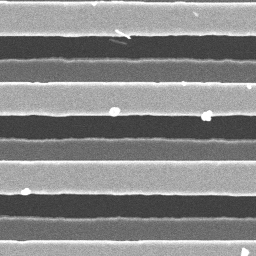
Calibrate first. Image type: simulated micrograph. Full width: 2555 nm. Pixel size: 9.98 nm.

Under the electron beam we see lines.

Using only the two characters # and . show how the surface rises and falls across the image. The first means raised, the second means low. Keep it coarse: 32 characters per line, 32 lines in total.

################################
################################
################################
################################
.......###....###.#.............
................................
................................
....####.....##...####.#........
################################
################################
################################
################################
################################
################################
......###.....#.........###.....
................................
................................
####.####################.##....
################################
################################
################################
################################
################################
################################
................................
................................
................................
################################
################################
################################
################################
################################